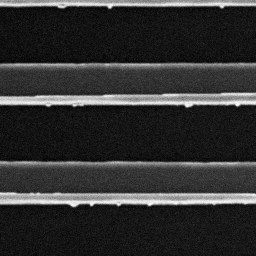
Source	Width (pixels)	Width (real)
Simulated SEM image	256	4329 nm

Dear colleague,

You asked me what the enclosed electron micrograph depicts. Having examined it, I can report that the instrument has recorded lines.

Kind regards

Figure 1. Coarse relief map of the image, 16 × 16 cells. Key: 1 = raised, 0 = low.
0000000000000000
0000000000000000
0000000000000000
0000000000000000
1111111111111111
1111111111111111
1111110010011010
0000000000000000
0000000000000000
0000000000000000
1111111111111111
1111111111111111
1111111111111111
0000000000000000
0000000000000000
0000000000000000